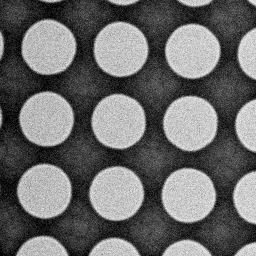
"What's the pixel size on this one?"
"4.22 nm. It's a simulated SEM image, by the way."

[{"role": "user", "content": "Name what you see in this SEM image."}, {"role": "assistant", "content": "an array of small figures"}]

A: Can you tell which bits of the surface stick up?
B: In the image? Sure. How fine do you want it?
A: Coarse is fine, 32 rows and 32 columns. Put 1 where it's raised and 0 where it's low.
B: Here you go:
00000000000000010000000111000000
00000000000000000000000000000000
00000000000000000000000000000000
00001111000001111000001111000000
00011111100011111100011111100001
00011111100011111100011111100011
00011111100011111100011111100011
00011111100011111100011111100011
00001111000001111000001111100011
00000000000000000000000110000001
00000000000000000000000000000000
00000000000000000000000000000000
00001111000001111000001110000000
00011111100011111100011111100011
00011111100011111100011111100011
00011111100011111100011111100011
00011111100011111100011111100011
00001111000011111000011111000011
00000000000000000000000110000001
00000000000000000000000000000000
00000000000000000000000000000000
00011111000001110000001110000000
00011111100011111000011111000011
00111111100111111100111111100111
00111111100111111100111111100111
00011111000011111100111111100111
00001111000011111000011111000011
00000000000000000000001110000001
00000000000000000000000000000000
00000000000000000000000000000000
00011111000011110000001110000001
00111111000111111000011111000011